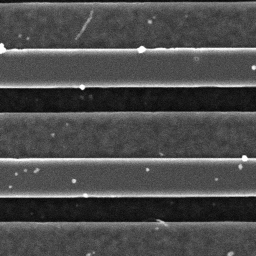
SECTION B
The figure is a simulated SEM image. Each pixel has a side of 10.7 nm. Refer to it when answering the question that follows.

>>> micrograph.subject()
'lines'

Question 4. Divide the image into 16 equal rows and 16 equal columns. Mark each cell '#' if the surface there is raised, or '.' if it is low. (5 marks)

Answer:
################
################
################
################
################
................
................
################
################
################
################
################
................
................
################
################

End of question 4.